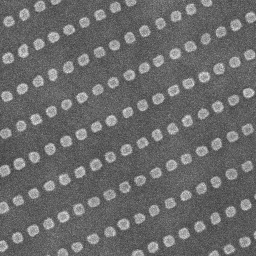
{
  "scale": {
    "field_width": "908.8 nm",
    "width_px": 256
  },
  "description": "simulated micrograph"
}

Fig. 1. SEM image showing a regular array of raised bodies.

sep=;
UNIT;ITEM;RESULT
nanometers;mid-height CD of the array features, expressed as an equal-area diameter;36.8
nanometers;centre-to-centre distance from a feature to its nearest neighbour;59.2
